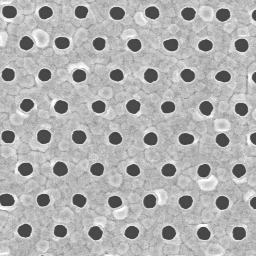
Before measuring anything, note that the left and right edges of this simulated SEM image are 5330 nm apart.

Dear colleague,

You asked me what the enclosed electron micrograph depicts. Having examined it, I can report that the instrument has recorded a regular array of holes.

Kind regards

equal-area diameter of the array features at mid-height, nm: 292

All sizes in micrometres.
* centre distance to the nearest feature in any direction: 0.726